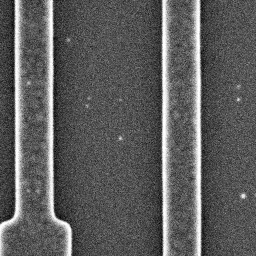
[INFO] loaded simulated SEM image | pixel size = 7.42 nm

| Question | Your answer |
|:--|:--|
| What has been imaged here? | wiring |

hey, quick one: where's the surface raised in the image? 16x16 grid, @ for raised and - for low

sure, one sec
-@@-------@@----
-@@-------@@----
-@@-------@@----
-@@-------@@----
-@@-------@@----
-@@-------@@----
-@@-------@@----
-@@-------@@----
-@@-------@@----
-@@-------@@----
-@@-------@@----
-@@-------@@----
-@@-------@@@---
-@@@------@@@---
@@@@------@@@---
@@@@------@@@---